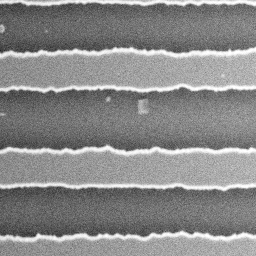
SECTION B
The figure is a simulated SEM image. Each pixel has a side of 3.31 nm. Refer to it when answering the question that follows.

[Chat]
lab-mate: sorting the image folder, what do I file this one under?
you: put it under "lines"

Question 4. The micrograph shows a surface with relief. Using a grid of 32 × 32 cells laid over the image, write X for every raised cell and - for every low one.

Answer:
---XXXXX--------XXX--XX-X--XX--X
--------------------------------
--------------------------------
--------------------------------
--------------------------------
--------------------------------
-X---X-XXXXXXXXXXXXXX---XXX-XXXX
XXXXXXXXXXXXXXXXXXXXXXXXXXXXXXXX
XXXXXXXXXXXXXXXXXXXXXXXXXXXXXXXX
XXXXXXXXXXXXXXXXXXXXXXXXXXXXXXXX
XXXXXXXXXXXXXXXXXXXXXXXXXXXXXXXX
--------------------------------
--------------------------------
--------------------------------
--------------------------------
--------------------------------
--------------------------------
--------------------------------
-X---------XXX-----X------------
XXXXXXXXXXXXXXXXXXXXXXXXXXXXXXXX
XXXXXXXXXXXXXXXXXXXXXXXXXXXXXXXX
XXXXXXXXXXXXXXXXXXXXXXXXXXXXXXXX
XXXXXXXXXXXXXXXXXXXXXXXXXXXXXXXX
---------X----------X--XXXXXX---
--------------------------------
--------------------------------
--------------------------------
--------------------------------
--------------------------------
-----XX-XXX-XXXXX--XXXXXXXX--XXX
XXXXXXXXXXXXXXXXXXXXXXXXXXXXXXXX
XXXXXXXXXXXXXXXXXXXXXXXXXXXXXXXX